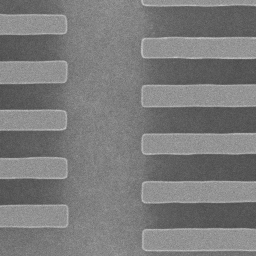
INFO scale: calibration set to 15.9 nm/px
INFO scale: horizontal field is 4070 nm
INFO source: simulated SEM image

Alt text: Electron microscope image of groups of lines, slits or small figures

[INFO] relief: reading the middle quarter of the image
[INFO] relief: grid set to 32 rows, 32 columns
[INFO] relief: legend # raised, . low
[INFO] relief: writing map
#...............................
#...............................
#...............................
#...............................
................................
....................############
...................#############
...................#############
...................#############
...................#############
....................##########..
................................
#...............................
#...............................
#...............................
................................
................................
..........................######
....................############
...................#############
...................#############
...................#############
....................####..######
................................
#...............................
#...............................
#...............................
#...............................
................................
....................############
....................############
....................############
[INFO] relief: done